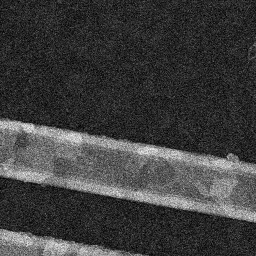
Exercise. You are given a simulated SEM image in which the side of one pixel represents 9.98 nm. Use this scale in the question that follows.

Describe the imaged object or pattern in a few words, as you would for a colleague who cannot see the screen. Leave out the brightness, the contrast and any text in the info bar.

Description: one or a few lines or trenches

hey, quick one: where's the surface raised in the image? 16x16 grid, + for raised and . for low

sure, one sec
................
................
................
................
................
................
................
................
++++............
++++++++++......
+++++++++++++++.
.....+++++++++++
..........++++++
................
................
++++............